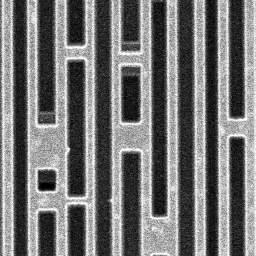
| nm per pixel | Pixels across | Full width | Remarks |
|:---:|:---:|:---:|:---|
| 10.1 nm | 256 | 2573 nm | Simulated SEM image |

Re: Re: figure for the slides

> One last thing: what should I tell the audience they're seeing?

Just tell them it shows parallel lines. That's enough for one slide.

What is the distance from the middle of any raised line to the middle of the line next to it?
271 nm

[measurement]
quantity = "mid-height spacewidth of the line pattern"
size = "15.2 px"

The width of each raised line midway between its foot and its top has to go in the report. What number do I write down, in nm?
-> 117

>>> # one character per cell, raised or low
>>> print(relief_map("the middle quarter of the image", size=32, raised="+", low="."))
+....+++....++++++++++....++....
+....+++....++++++++++....++....
+....+++....+++....+++....++....
+....+++....++.....+++....++....
+....+++....++.....+++....++....
+....+++....++.....+++....++....
+....+++....++.....+++....++....
+....+++....++.....+++....++....
+....+++....++.....+++....++....
+....+++....++.....+++....++....
+....+++....++.....+++....++....
+....+++....++.....+++....++....
+....+++....++.....+++....++....
+....+++....++.....+++....++....
+....+++....+++....+++....++....
+....+++....++++++++++....++....
+....+++....++++++++++....++....
+....+++....++++++++++....++....
+....+++....++++++++++....++....
+....+++....++++++++++....++....
+....+++....++++++++++....++....
+....+++....++++++++++....++....
+....+++....++.....+++....++....
+....+++....++.....+++....++....
+....+++....++.....+++....++....
+....+++....++.....+++....++....
+....+++....++.....+++....++....
+....+++....++.....+++....++....
+....+++....++.....+++....++....
+....+++....++.....+++....++....
+....+++....++.....+++....++....
+....+++....++.....+++....++....